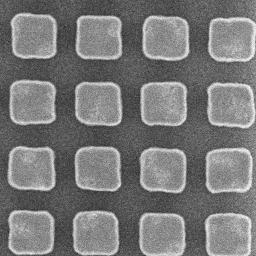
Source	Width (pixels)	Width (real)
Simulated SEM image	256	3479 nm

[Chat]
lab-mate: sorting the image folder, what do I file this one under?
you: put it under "a regular array of raised bodies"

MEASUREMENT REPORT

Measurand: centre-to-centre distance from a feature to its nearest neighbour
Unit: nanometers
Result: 886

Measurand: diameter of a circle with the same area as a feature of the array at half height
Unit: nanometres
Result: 659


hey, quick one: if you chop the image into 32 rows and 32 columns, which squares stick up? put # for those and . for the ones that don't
................................
................................
..#####...#####...#####....####.
.######...#####...#####...######
..#####...#####...#####...######
..#####...#####...######..######
..#####...#####...######..######
.....................#.....####.
................................
................................
..####....####....#####....##...
.######..######...#####...#####.
.######...#####...#####...######
.######..######...#####...######
.######...#####...#####...######
..#.........###...#####....####.
................................
................................
..####....####..................
.######..######...#####...#####.
.######..######...#####...#####.
.######..######...#####...#####.
.######..######...#####...#####.
..####....#####...#####...#####.
................................
................................
..####....####..................
.######..######...#####...#####.
.######..######..######...#####.
.######..######..######...#####.
.######..######..######...#####.
..####....####....#####...#####.